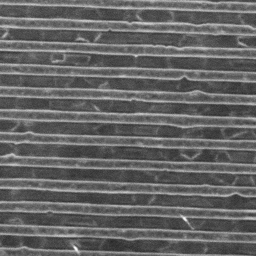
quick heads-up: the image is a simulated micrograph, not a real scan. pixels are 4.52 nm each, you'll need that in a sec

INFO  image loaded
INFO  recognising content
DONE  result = parallel lines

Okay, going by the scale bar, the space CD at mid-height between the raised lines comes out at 12.7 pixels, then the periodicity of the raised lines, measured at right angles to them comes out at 104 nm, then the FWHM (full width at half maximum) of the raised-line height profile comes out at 45.2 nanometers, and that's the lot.